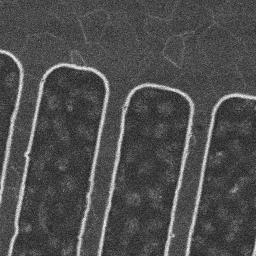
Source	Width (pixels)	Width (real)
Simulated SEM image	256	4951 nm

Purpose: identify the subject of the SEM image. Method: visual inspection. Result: one or a few lines or trenches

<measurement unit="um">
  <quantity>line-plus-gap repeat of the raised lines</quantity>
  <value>1.68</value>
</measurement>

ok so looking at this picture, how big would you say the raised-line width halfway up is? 21.3 pixels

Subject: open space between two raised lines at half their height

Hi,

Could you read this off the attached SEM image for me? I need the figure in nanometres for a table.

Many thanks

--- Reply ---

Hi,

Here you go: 1290